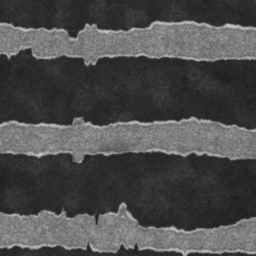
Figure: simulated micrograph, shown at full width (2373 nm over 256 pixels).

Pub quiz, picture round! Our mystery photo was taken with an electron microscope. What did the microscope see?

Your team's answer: one or a few lines or trenches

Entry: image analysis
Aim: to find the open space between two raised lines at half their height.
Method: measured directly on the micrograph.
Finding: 614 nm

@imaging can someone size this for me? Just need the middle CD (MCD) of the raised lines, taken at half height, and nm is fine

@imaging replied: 274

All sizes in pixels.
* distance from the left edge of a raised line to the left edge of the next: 96.1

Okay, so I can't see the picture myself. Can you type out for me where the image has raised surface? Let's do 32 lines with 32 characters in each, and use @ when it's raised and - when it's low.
--------------------------------
--------------------------------
--------------------------------
@@---------@------@@@@@@@@@@@@@-
@@@@@@@@@-@@@@@@@@@@@@@@@@@@@@@@
@@@@@@@@@@@@@@@@@@@@@@@@@@@@@@@@
@@--@@@@@@@@@@@@@@@@@@@@@@@@@@@@
----------@@------------@-@-----
--------------------------------
--------------------------------
--------------------------------
--------------------------------
--------------------------------
--------------------------------
--------------------------------
-@@------@@----@@@@@@@@@@@@@----
@@@@@@@@@@@@@@@@@@@@@@@@@@@@@@@@
@@@@@@@@@@@@@@@@@@@@@@@@@@@@@@@@
@@@@@@@@@@@@@@@@@@@@@@@@@@@@@@@@
---------@@----------------@@@@@
--------------------------------
--------------------------------
--------------------------------
--------------------------------
--------------------------------
--------------------------------
-----@---------@----------------
@@@@@@@@@@@@@@@@@-------------@@
@@@@@@@@@@@@@@@@@@@@-------@@@@@
@@@@@@@@@@@@@@@@@@@@@@@@@@@@@@@@
@@@@@@@@@@@@@@@@@@@@@@@@@@@@@@@@
-----------------------@---@---@